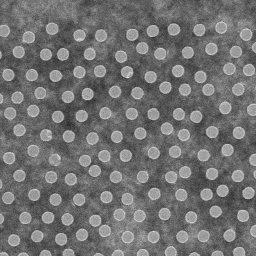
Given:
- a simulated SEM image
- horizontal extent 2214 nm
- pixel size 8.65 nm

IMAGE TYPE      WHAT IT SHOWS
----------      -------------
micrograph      a regular array of raised bodies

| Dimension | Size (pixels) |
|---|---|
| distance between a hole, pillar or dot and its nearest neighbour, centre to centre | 20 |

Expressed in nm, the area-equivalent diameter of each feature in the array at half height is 101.